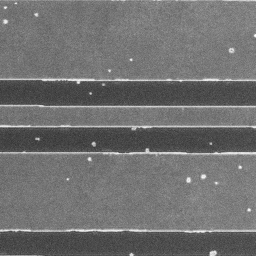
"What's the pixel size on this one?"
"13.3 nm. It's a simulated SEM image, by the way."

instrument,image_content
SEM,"lines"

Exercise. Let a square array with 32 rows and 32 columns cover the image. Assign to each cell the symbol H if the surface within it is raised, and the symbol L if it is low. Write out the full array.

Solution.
HHHHHHHHHHHHHHHHHHHHHHHHHHHHHHHH
HHHHHHHHHHHHHHHHHHHHHHHHHHHHHHHH
HHHHHHHHHHHHHHHHHHHHHHHHHHHHHHHH
HHHHHHHHHHHHHHHHHHHHHHHHHHHHHHHH
HHHHHHHHHHHHHHHHHHHHHHHHHHHHHHHH
HHHHHHHHHHHHHHHHHHHHHHHHHHHHHHHH
HHHHHHHHHHHHHHHHHHHHHHHHHHHHHHHH
HHHHHHHHHHHHHHHHHHHHHHHHHHHHHHHH
HHHHHHHHHHHHHHHHHHHHHHHHHHHHHHHH
HHHHHHHHHHHHHHHHHHHHHHHHHHHHHHHH
LLLLLLLLLLLLLLLLLLLLLLLLLLLLLLLL
LLLLLLLLLLLLLLLLLLLLLLLLLLLLLLLL
LLLLLLLLLLLLLLLLLLLLLLLLLLLLLLLL
HHHHHHHHHHHHHHHHHHHHHHHHHHHHHHHH
HHHHHHHHHHHHHHHHHHHHHHHHHHHHHHHH
HHHHHHHHHHHHHHHHHHHHHHHHHHHHHHHH
LLLLLLLLLLLLLLLLLLLLLLLLLLLLLLLL
LLLLLLLLLLLLLLLLLLLLLLLLLLLLLLLL
LLLLLLLLLLLLLLLLLLLLLLLLLLLLLLLL
HHHHHHHHHHHHHHHHHHHHHHHHHHHHHHHH
HHHHHHHHHHHHHHHHHHHHHHHHHHHHHHHH
HHHHHHHHHHHHHHHHHHHHHHHHHHHHHHHH
HHHHHHHHHHHHHHHHHHHHHHHHHHHHHHHH
HHHHHHHHHHHHHHHHHHHHHHHHHHHHHHHH
HHHHHHHHHHHHHHHHHHHHHHHHHHHHHHHH
HHHHHHHHHHHHHHHHHHHHHHHHHHHHHHHH
HHHHHHHHHHHHHHHHHHHHHHHHHHHHHHHH
HHHHHHHHHHHHHHHHHHHHHHHHHHHHHHHH
HHHHHHHHHHHHHHHHHHHHHHHHHHHHHHHH
LLLLLLLLLLLLLLLLLLLLLLLLLLLLLLLL
LLLLLLLLLLLLLLLLLLLLLLLLLLLLLLLL
LLLLLLLLLLLLLLLLLLLLLLLLLLLLLLLL